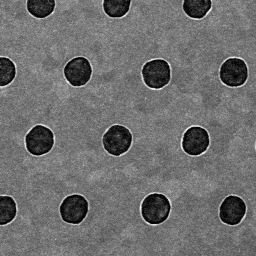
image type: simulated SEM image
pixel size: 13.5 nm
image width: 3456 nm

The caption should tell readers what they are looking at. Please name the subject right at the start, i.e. a regular array of holes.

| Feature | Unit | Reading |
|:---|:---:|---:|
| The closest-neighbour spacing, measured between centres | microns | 1.04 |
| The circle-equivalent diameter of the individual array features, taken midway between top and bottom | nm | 396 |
